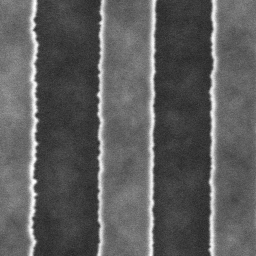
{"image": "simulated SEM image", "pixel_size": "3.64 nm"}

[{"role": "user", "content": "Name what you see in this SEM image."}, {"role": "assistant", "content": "lines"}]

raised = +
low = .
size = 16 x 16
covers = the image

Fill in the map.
++....++++...+++
++....++++...+++
++....++++...+++
++....++++...+++
++....++++...+++
++....++++...+++
++....++++...+++
++....++++...+++
++....++++...+++
++....++++...+++
++....++++...+++
++....++++...+++
++....++++...+++
++....++++...+++
++....++++...+++
++....++++...+++